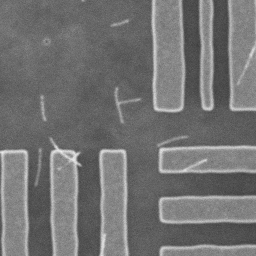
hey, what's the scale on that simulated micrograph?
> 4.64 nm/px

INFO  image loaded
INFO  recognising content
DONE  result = groups of lines, slits or small figures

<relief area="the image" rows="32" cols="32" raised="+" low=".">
...................++++..++..+++
...................++++..++..+++
...................++++..++..+++
...................++++..++..+++
...................++++..++..+++
...................++++..++..+++
...................++++..++..+++
...................++++..++..+++
...................++++..++..+++
...................++++..++..+++
...................++++..++..+++
...................++++..++..+++
...................++++..++..+++
...................++++......+++
................................
................................
................................
................................
........................++++++++
+++...++++...+++....++++++++++++
+++...++++...+++....++++++++++++
+++...++++...+++................
+++...++++...+++................
+++...++++...+++................
+++...++++...+++................
+++...++++...+++....++++++++++++
+++...++++...+++....++++++++++++
+++...++++...+++....++++++++++++
+++...++++...+++................
+++....+++...+++................
+++....+++...+++................
+++....+++...+++....++++++++++++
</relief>